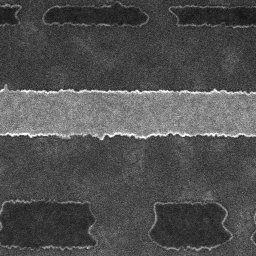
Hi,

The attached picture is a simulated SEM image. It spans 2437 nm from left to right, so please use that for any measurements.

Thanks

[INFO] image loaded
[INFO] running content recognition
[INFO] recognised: one or a few lines or trenches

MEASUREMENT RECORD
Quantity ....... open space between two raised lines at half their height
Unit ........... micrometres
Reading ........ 0.629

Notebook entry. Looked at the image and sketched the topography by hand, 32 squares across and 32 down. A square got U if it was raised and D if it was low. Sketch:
DDDDDDDDDDDDDDUDDDDDDDDDDDDDDDDD
UUDDDDUUUUUUUUUUUUDDDUUUUUUUUUUU
UUDDDUUUUUUUUUUUUUDDDDUUUUUUUUUU
DDDDDDDDDDDDDDDDDDDDDDDDDDDDDDDD
DDDDDDDDDDDDDDDDDDDDDDDDDDDDDDDD
DDDDDDDDDDDDDDDDDDDDDDDDDDDDDDDD
DDDDDDDDDDDDDDDDDDDDDDDDDDDDDDDD
DDDDDDDDDDDDDDDDDDDDDDDDDDDDDDDD
DDDDDDDDDDDDDDDDDDDDDDDDDDDDDDDD
DDDDDDDDDDDDDDDDDDDDDDDDDDDDDDDD
DDDDDDDDDDDDDDDDDDDDDDDDDDDDDDDD
UUUUUUUUUUUUUUUUUUUUUUUUDDUUUDDD
UUUUUUUUUUUUUUUUUUUUUUUUUUUUUUUU
UUUUUUUUUUUUUUUUUUUUUUUUUUUUUUUU
UUUUUUUUUUUUUUUUUUUUUUUUUUUUUUUU
UUUUUUUUUUUUUUUUUUUUUUUUUUUUUUUU
UUUUUUUUUUUUUUUUUUUUUUUUUUUUUUUU
DDDDDDDDDDDDDDDDDDDDDDDDDDDDDDDD
DDDDDDDDDDDDDDDDDDDDDDDDDDDDDDDD
DDDDDDDDDDDDDDDDDDDDDDDDDDDDDDDD
DDDDDDDDDDDDDDDDDDDDDDDDDDDDDDDD
DDDDDDDDDDDDDDDDDDDDDDDDDDDDDDDD
DDDDDDDDDDDDDDDDDDDDDDDDDDDDDDDD
DDDDDDDDDDDDDDDDDDDDDDDDDDDDDDDD
DDDDDDDDDDDDDDDDDDDDDDDDDDDDDDDD
UUUUUUUUUUUDDDDDDDDDUUUUUUUDDDDD
UUUUUUUUUUUDDDDDDDDUUUUUUUUUDDDD
UUUUUUUUUUUUDDDDDDDUUUUUUUUUDDDD
UUUUUUUUUUUDDDDDDDDUUUUUUUUUDDDD
UUUUUUUUUUUDDDDDDDDUUUUUUUUUUDDD
UUUUUUUUUUUUDDDDDDDDUUUUUUUUDDDD
DDDDDDDDDDDDDDDDDDDDDDDDDDDDDDDD